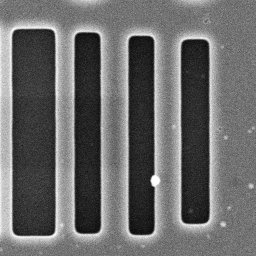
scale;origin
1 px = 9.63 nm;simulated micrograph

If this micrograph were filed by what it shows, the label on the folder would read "groups of lines, slits or small figures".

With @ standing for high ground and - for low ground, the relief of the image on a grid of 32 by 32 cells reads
@@@@@@@@@@@@@@@@@@@@@@@@@@@@@@@@
@@@@@@@@@@@@@@@@@@@@@@@@@@@@@@@@
@@@@@@@@@@@@@@@@@@@@@@@@@@@@@@@@
@@@---@@@@@@@@@@@@@@@@@@@@@@@@@@
@------@@----@@@@--@@@@@@@@@@@@@
@------@@----@@@---@@@@---@@@@@@
@------@@----@@@---@@@----@@@@@@
@------@@----@@@---@@@----@@@@@@
@------@@----@@@---@@@----@@@@@@
@------@@----@@@---@@@----@@@@@@
@------@@----@@@---@@@----@@@@@@
@------@@----@@@---@@@----@@@@@@
@------@@----@@@---@@@----@@@@@@
@------@@----@@@---@@@----@@@@@@
@------@@----@@@---@@@----@@@@@@
@------@@----@@@---@@@----@@@@@@
@------@@----@@@---@@@----@@@@@@
@------@@----@@@---@@@----@@@@@@
@------@@----@@@---@@@----@@@@@@
@------@@----@@@---@@@----@@@@@@
@------@@----@@@---@@@----@@@@@@
@------@@----@@@---@@@----@@@@@@
@------@@----@@@---@@@----@@@@@@
@------@@----@@@---@@@----@@@@@@
@------@@----@@@---@@@----@@@@@@
@------@@----@@@---@@@----@@@@@@
@------@@----@@@---@@@----@@@@@@
@------@@----@@@---@@@@---@@@@@@
@------@@----@@@---@@@@@@@@@@@@@
@@----@@@@@@@@@@@-@@@@@@@@@@@@@@
@@@@@@@@@@@@@@@@@@@@@@@@@@@@@@@@
@@@@@@@@@@@@@@@@@@@@@@@@@@@@@@@@